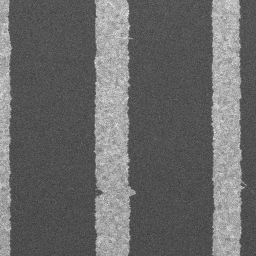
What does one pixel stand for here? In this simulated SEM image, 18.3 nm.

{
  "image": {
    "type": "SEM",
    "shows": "one or a few lines or trenches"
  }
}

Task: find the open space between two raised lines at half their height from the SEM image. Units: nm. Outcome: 1570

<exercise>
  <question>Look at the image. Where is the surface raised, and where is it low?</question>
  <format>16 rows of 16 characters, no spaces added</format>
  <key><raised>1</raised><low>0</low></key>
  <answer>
1000001100000110
0000001100000110
1000001100000110
1000001100000110
1000001100000110
1000001100000110
1000001100000110
1000001100000110
1000001100000110
1000001100000110
1000001100000110
1000001100000110
1000001100000110
1000001100000110
1000001100000110
1000001100000110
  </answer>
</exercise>